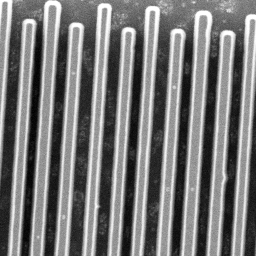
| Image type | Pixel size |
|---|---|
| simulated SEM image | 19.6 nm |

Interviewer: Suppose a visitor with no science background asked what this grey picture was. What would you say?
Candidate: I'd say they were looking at parallel lines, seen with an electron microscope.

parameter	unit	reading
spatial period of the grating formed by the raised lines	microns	0.484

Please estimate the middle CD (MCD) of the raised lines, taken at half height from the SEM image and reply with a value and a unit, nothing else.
0.225 um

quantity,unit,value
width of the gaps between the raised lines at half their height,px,13.1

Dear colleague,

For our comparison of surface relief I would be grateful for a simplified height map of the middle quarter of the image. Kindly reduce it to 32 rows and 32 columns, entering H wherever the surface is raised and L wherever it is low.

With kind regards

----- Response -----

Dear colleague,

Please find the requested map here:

LHHHLLLLHHLLLLHHHLLLHHHLLLHHHLLL
LHHHLLLLHHLLLLHHHLLLHHLLLLHHHLLL
LHHHLLLLHHLLLLHHHLLLHHLLLLHHHLLL
LHHHLLLLHHLLLLHHHLLLHHLLLLHHHLLL
LHHHLLLLHHLLLLHHHLLLHHLLLLHHHLLL
LHHLLLLLHHLLLLHHHLLLHHLLLLHHHLLL
LHHLLLLLHHLLLLHHHLLLHHLLLLHHHLLL
LHHHLLLLHHLLLLHHHLLLHHLLLLHHHLLL
LHHLLLLHHHLLLLHHLLLLHHLLLLHHHLLL
LHHLLLLHHHLLLLHHLLLHHHLLLLHHHLLL
HHHLLLLHHHLLLLHHLLLHHHLLLLHHHLLL
HHHLLLLHHHLLLLHHLLLHHHLLLLHHHLLL
HHHLLLLHHHLLLLHHLLLHHHLLLLHHHLLL
HHHLLLLHHHLLLLHHLLLHHHLLLLHHHLLL
HHHLLLLHHLLLLHHHLLLHHHLLLLHHLLLL
HHHLLLLHHLLLLHHHLLLHHHLLLHHHLLLH
HHHLLLLHHLLLLHHHLLLHHLLLLHHHLLLH
HHHLLLLHHLLLLHHHLLLHHLLLLHHHLLLH
HHHLLLLHHLLLLHHHLLLHHLLLLHHHLLLH
HHHLLLLHHLLLLHHHLLLHHLLLLHHHLLLH
HHLLLLLHHLLLLHHHLLLHHLLLLHHHLLLH
HHLLLLLHHLLLLHHLLLLHHLLLLHHHLLLH
HHLLLLLHHLLLLHHLLLLHHLLLLHHHLLLH
HHLLLLHHHLLLLHHLLLLHHLLLLHHHLLLH
HHLLLLHHHLLLLHHLLLLHHLLLLHHHLLLH
HHLLLLHHHLLLLHHLLLHHHLLLLHHHLLLH
HHLLLLHHHLLLLHHLLLHHHLLLLHHHLLLH
HHLLLLHHHLLLLHHLLLHHHLLLLHHHLLLH
HHLLLLHHHLLLLHHLLLHHHLLLLHHHLLLH
HHLLLLHHHLLLHHHLLLHHHLLLLHHLLLLH
HHLLLLHHLLLLHHHLLLHHHLLLLHHLLLHH
HHLLLLHHLLLLHHHLLLHHLLLLHHHLLLHH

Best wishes